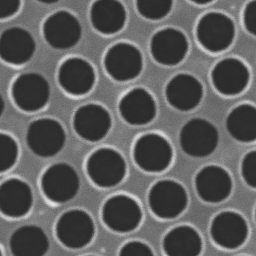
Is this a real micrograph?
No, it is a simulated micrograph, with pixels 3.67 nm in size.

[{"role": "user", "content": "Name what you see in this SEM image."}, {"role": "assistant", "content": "a regular array of holes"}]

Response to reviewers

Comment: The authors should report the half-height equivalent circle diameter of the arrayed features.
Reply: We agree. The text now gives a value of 142 nm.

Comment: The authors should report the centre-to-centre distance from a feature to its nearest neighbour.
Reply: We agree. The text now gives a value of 176 nm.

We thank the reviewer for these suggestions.